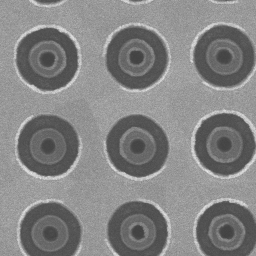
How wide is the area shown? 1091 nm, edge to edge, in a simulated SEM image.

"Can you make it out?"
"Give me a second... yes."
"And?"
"ring-shaped grooves with a dot in the middle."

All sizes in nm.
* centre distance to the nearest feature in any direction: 370